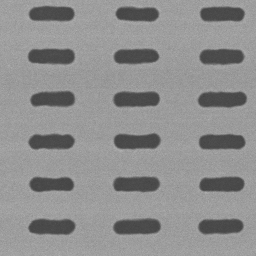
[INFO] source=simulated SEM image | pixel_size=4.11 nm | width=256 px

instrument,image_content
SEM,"a regular array of holes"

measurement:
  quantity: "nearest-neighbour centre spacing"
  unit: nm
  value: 173